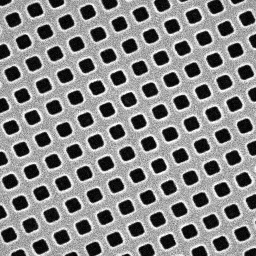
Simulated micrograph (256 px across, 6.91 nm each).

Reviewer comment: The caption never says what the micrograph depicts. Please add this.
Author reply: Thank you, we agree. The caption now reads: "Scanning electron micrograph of a regular array of holes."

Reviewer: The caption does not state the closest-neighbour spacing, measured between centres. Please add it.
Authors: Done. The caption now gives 162 nm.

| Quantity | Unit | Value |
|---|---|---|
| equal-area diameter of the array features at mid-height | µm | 0.104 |